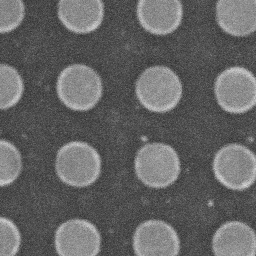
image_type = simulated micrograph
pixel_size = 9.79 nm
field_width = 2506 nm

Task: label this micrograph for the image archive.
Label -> raised bodies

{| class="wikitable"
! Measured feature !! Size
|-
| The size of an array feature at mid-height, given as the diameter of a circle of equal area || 430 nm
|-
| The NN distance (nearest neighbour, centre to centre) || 0.749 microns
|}